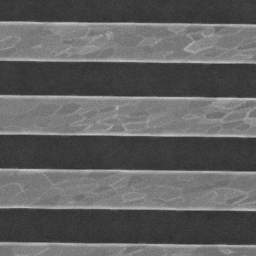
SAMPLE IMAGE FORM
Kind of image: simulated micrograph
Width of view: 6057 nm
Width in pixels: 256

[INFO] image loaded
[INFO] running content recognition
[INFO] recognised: wiring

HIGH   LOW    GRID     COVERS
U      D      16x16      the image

DDDDDDDDDDDDDDDD
UUUUUUUUUDDDDDDD
UUUUUUUUUUUUUUUU
UUUUUUUUUUUUUUUU
DDDDDDDDDDDDDDDD
DDDDDDDDDDDDDDDD
UUUUUUUUUUUUUUUU
UUUUUUUUUUUUUUUU
DDDDDDDDDDDDDDUU
DDDDDDDDDDDDDDDD
DDDDDDDDDDDDDDDD
UUUUUUUUUUUUUUUU
UUUUUUUUUUUUUUUU
DDDDDDDDDDDDDDDD
DDDDDDDDDDDDDDDD
UUUUUUUUUUUUUUUU